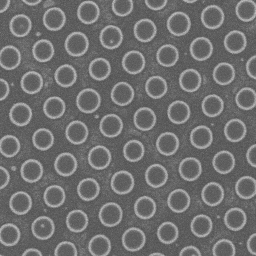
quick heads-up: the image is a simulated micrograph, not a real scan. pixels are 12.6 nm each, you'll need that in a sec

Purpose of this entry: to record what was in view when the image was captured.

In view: a regular array of raised bodies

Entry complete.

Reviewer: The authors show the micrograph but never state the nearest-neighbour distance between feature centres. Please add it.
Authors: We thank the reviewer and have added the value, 424 nm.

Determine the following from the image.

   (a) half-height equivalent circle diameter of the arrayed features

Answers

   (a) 267 nanometers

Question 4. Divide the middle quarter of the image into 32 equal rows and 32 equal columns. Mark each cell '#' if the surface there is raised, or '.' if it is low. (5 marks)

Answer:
#......####....#####............
###...#####.....###............#
###....####...................##
###.....##............##.....###
##...................####....###
#............###.....####....###
......#.....#####....#####....##
....####....#####....####.......
...######...#####...............
...######....###............#...
...######..................####.
....####...........##.....#####.
..................####....#####.
..........####....#####....####.
...#.....#####....#####....###..
.####....#####....####..........
.#####...#####..................
.#####....###............##.....
.####...................####....
..##............##.....#####....
...............#####...#####....
.......####....#####....####....
#.....#####....#####.....##.....
###...#####.....###.............
###...#####...................##
###....###............##.....###
###..................####....###
##...........###.....#####...###
............#####....#####....##
....####....#####....####.......
....#####...#####.....##........
....#####...####................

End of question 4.